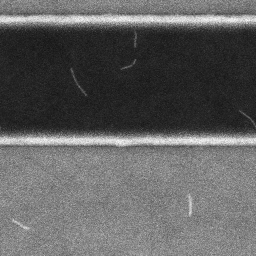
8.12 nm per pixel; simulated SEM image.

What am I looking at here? one or a few lines or trenches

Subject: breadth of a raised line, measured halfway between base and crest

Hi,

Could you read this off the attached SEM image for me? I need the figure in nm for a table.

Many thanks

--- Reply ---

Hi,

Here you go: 1000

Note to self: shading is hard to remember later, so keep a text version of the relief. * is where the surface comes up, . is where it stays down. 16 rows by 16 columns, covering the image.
................
****************
****************
****************
****************
****************
****************
****************
****************
................
................
................
................
................
................
................